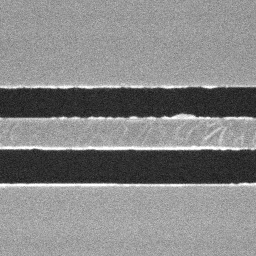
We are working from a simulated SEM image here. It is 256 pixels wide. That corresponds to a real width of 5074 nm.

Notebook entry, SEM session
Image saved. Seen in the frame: lines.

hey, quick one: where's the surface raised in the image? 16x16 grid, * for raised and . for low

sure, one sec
****************
****************
****************
****************
****************
................
................
****************
****************
................
................
................
****************
****************
****************
****************